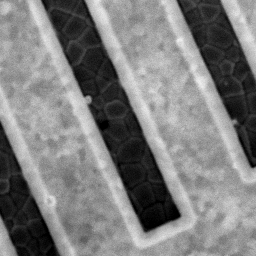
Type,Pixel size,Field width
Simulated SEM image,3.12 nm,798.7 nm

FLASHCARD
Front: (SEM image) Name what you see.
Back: one or a few lines or trenches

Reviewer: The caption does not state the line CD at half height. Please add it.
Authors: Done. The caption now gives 0.231 micrometres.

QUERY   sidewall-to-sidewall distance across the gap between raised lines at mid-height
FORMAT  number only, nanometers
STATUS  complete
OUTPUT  158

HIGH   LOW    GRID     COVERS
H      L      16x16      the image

HHLLLLHHHHHLLLHH
HHHLLLHHHHHLLLLH
HHHLLLLHHHHHLLLH
HHHHLLLHHHHHLLLL
HHHHLLLLHHHHHLLL
HHHHHLLLHHHHHLLL
HHHHHLLLHHHHHHLL
HHHHHHLLLHHHHHLL
LHHHHHLLLHHHHHLL
LHHHHHLLLLHHHHHL
LLHHHHHLLLHHHHHL
LLHHHHHLLLLHHHHH
LLLHHHHHLLLHHHHH
LLLHHHHHLLLLHHHH
LLLHHHHHHLHHHHHH
HLLLHHHHHHHHHHHH